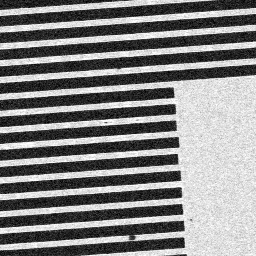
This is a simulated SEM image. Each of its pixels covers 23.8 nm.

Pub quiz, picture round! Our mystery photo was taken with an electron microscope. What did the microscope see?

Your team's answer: parallel lines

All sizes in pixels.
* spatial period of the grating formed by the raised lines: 16.7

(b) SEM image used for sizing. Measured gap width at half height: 270 nm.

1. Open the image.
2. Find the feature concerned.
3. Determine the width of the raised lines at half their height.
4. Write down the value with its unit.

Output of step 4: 128 nanometers